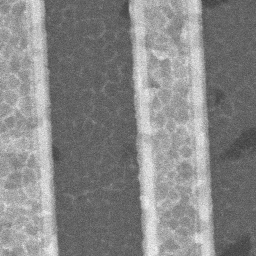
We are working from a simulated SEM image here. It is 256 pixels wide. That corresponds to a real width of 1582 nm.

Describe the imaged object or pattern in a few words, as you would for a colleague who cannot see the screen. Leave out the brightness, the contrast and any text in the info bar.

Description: one or a few lines or trenches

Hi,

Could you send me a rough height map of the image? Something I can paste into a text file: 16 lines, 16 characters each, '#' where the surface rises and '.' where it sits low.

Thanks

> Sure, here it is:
##.......###....
##.......###....
##.......###....
##.......###....
##.......###....
###......###....
###......###....
###......###....
###......###....
###......####...
###......####...
###......####...
###......####...
###......####...
###......####...
###.......###...